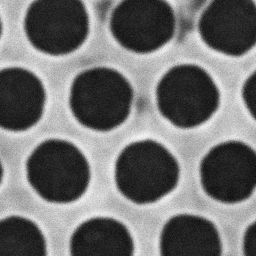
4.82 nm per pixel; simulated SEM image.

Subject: holes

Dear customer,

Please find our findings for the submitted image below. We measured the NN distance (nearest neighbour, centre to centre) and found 410 nm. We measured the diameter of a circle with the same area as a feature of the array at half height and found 0.314 micrometres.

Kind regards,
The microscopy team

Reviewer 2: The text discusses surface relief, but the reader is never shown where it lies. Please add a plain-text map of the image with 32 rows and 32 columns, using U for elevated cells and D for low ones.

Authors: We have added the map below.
UUUUDDDDDDDUUUUDDDDDDUUUUUDDDDDD
UUUDDDDDDDDUUUDDDDDDDDUUUDDDDDDD
UUUDDDDDDDDUUUDDDDDDDDUUUDDDDDDD
UUUDDDDDDDDUUUDDDDDDDDUUUDDDDDDD
UUUDDDDDDDDUUUDDDDDDDDUUUDDDDDDD
UUUUDDDDDDUUUUUDDDDDDUUUUUDDDDDD
UUUUUDDDDUUUUUUUUDDUUUUUUUUDDDDU
UUUUUUUUUUUUUUUUUUUUUUUUUUUUUUUU
DDDUUUUUUUUDDDUUUUUUUDDDDUUUUUUU
DDDDDUUUUUDDDDDDUUUUDDDDDDUUUUUD
DDDDDUUUUDDDDDDDUUUUDDDDDDDUUUDD
DDDDDDUUUDDDDDDDDUUDDDDDDDDDUUDD
DDDDDDUUUDDDDDDDDUUUDDDDDDDDUUDD
DDDDDDUUUDDDDDDDUUUUDDDDDDDUUUUD
DDDDDUUUUDDDDDDDUUUUDDDDDDDUUUUD
DDDDDUUUUUDDDDDUUUUUUUDDDUUUUUUU
UUUUUUUUUUUUUUUUUUUUUUUUUUUUUUUU
UUUUUUDDUUUUUUUUUUDUUUUUUUUUUUUU
UUUUDDDDDDUUUUUDDDDDDUUUUUDDDDDD
UUUUDDDDDDDUUUUDDDDDDDUUUUDDDDDD
UUUDDDDDDDDUUUDDDDDDDDUUUDDDDDDD
UUUDDDDDDDDUUUDDDDDDDDUUUDDDDDDD
UUUDDDDDDDDUUUDDDDDDDDUUUDDDDDDD
UUUUDDDDDDDUUUUDDDDDDDUUUDDDDDDD
UUUUUDDDDDUUUUUDDDDDDUUUUUDDDDDU
UUUUUUUUUUUUUUUUUDUUUUUUUUUUDUUU
UUUUUUUUUUUUUUUUUUUUUUUUUUUUUUUU
DDDDUUUUUUUDDDDUUUUUUDDDDDUUUUUU
DDDDDUUUUUDDDDDDUUUUDDDDDDDUUUUD
DDDDDDUUUDDDDDDDUUUUDDDDDDDUUUDD
DDDDDDUUUDDDDDDDDUUUDDDDDDDDUUDD
DDDDDDUUUDDDDDDDDUUUDDDDDDDDUUDD